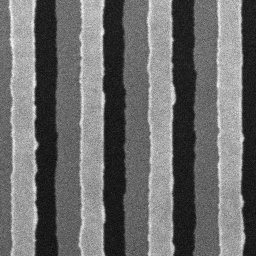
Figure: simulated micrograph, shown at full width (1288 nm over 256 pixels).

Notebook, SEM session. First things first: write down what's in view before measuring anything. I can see lines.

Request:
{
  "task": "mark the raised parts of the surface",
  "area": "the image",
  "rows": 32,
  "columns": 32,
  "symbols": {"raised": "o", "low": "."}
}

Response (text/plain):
oooo...oooooo...ooooo...oooooo..
oooo...oooooo...ooooo...oooooo..
oooo...oooooo..oooooo...oooooo..
oooo...oooooo...ooooo...oooooo..
oooo...oooooo...oooooo..oooooo..
oooo...oooooo...oooooo..oooooo..
oooo...oooooo...ooooo...oooooo..
oooo...oooooo...ooooo...oooooo..
oooo...oooooo...oooooo..oooooo..
oooo...oooooo...oooooo...ooooo..
oooo...oooooo...oooooo...ooooo..
oooo...oooooo...oooooo..oooooo..
oooo...oooooo...oooooo..oooooo..
oooo...oooooo...oooooo..oooooo..
oooo...oooooo...oooooo..oooooo..
oooo...oooooo...ooooo...oooooo..
oooo...oooooo...ooooo...oooooo..
ooooo..oooooo...ooooo....ooooo..
ooooo..oooooo...oooooo..oooooo..
oooo...oooooo...oooooo..oooooo..
ooooo..oooooo...ooooo...oooooo..
ooooo..oooooo...oooooo..oooooo..
oooo...oooooo...oooooo..oooooo..
oooo...oooooo...oooooo..oooooo..
oooo...oooooo...oooooo..oooooo..
oooo...oooooo...oooooo..oooooo..
ooooo..oooooo...oooooo...ooooo..
ooooo..oooooo...oooooo...ooooo..
oooo...oooooo...oooooo..oooooo..
oooo...oooooo...oooooo..ooooooo.
oooo...oooooo...oooooo..ooooooo.
oooo...oooooo...oooooo..oooooo..